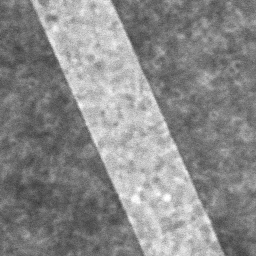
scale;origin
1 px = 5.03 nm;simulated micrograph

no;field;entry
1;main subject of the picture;one or a few lines or trenches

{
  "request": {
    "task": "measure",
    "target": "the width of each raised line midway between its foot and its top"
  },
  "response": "360 nanometers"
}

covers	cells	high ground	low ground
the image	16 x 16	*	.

..*****.........
...*****........
...*****........
....****........
....*****.......
....*****.......
.....*****......
.....*****......
......*****.....
......*****.....
.......*****....
.......*****....
........*****...
........*****...
........*****...
.........*****..